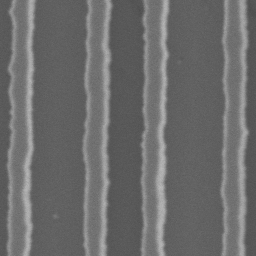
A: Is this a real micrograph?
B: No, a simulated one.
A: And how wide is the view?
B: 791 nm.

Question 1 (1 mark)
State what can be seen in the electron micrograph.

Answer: lines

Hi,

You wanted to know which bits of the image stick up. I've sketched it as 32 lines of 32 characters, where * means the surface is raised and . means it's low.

..**.......***....***.......***.
.***.......***....***.......***.
..**.......***....***.......***.
..**.......**.....***.......***.
..**.......**.....***.......***.
..**.......**.....***.......***.
..**.......***....***.......***.
.***.......***....***.......***.
.***.......**.....***.......***.
.***.......***....***.......***.
.***.......**.....***.......***.
.***.......***....***.......***.
.***.......***....***.......***.
.***.......**.....***.......***.
.***.......**.....***.......***.
.***.......**.....***.......***.
.***.......**.....**........***.
.***......***.....**........***.
.***......***.....**........***.
.***......***.....**........**..
.***.......**.....**........**..
.***.......**.....**........**..
.***.......**.....**........**..
.***.......**.....**........**..
.**........**.....**........***.
.***.......**.....**........***.
.***.......**.....**........***.
.***.......**.....**........**..
.***.......**.....**........**..
.***.......**.....**........**..
.***.......**.....**........**..
.***.......**.....**........**..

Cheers